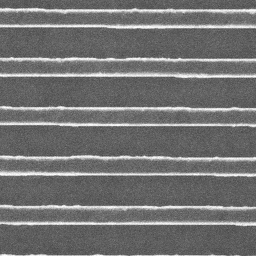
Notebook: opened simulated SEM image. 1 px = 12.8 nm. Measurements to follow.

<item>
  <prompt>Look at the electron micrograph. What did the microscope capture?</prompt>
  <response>lines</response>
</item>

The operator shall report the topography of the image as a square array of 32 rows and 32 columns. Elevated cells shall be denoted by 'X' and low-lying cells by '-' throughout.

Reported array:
--------------------------------
XXXXXXXXXXXXXXXXXXXXXXXXXXXXXXXX
XXXXXXXXXXXXXXXXXXXXXXXXXXXXXXXX
--------------------------------
--------------------------------
--------------------------------
--------------------------------
XXXXXXXXXXXXXXXXXXXXXXXXXXXXXXXX
XXXXXXXXXXXXXXXXXXXXXXXXXXXXXXXX
-------------------------XXXXXXX
--------------------------------
--------------------------------
--------------------------------
XXXXXXXXXXXXXXXXXXXXXXXX--------
XXXXXXXXXXXXXXXXXXXXXXXXXXXXXXXX
XXXXXXXXXXXXXXXXXXXXXXXXXXXXXXXX
--------------------------------
--------------------------------
--------------------------------
--------------------------------
XXXXXXXXXXXXXXXXXXXXXXXXXXXXXXXX
XXXXXXXXXXXXXXXXXXXXXXXXXXXXXXXX
--------------------------------
--------------------------------
--------------------------------
--------------------------------
XXXXXXXXXXXXXXXXXXXXXXXXXXXXXXXX
XXXXXXXXXXXXXXXXXXXXXXXXXXXXXXXX
--------------------------------
--------------------------------
--------------------------------
--------------------------------